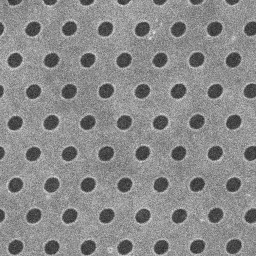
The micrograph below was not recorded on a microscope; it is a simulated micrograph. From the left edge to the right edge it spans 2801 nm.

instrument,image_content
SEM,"a regular array of holes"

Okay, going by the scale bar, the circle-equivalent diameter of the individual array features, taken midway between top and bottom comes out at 169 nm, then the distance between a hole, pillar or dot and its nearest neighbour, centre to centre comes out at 0.391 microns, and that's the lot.